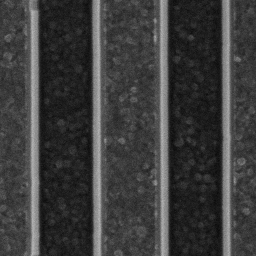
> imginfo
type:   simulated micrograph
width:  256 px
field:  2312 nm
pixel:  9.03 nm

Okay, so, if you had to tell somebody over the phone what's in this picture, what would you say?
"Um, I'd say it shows one or a few lines or trenches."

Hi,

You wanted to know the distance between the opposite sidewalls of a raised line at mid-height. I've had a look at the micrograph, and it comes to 604 nm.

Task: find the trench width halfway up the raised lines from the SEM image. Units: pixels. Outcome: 62.4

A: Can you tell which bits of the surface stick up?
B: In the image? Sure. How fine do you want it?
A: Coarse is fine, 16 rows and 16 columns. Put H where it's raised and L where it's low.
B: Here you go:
HHLLLLHHHHLLLLHH
HHLLLLHHHHLLLLHH
HHLLLLHHHHLLLLHH
HHLLLLHHHHLLLLHH
HHLLLLHHHHLLLLHH
HHLLLLHHHHLLLLHH
HHLLLLHHHHLLLLHH
HHLLLLHHHHLLLLHH
HHLLLLHHHHLLLLHH
HHLLLLHHHHLLLLHH
HHLLLLHHHHLLLLHH
HHLLLLHHHHLLLLHH
HHLLLLHHHHLLLLHH
HHLLLLHHHHLLLLHH
HHLLLLHHHHLLLLHH
HHLLLLHHHHLLLLHH